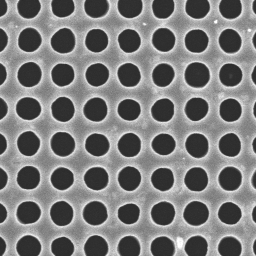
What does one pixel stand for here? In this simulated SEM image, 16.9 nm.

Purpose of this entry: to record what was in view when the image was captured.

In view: a regular array of holes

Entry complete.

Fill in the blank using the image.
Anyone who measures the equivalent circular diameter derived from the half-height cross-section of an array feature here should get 0.397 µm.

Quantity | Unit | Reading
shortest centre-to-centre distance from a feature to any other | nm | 562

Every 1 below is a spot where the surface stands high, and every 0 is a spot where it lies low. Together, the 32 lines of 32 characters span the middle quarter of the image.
00111100001111000011111000011110
00111100000110000001110000011100
00011000000110000001110000001100
00011000000111000001110000011100
00111100001111000001110000011110
11111110011111100011111000111111
11111111111111111111111111111111
11111111111111111111111111111111
01111110011111111111111110111111
00111100001111000011111000011110
00011000000111000001110000011110
00011000000110000001110000001100
00011000000111000001110000011110
00111100001111100011110000011110
11111111011111111111111101111111
11111111111111111111111111111111
11111111111111111111111111111111
01111110011111100011111100111111
00111100001111000001110000011110
00011000000111000001110000001100
00011000000110000001110000001100
00011000000111000001110000011110
00111110001111000011111100111110
11111111111111111111111111111111
11111111111111111111111111111111
11111111111111111111111111111111
01111100001111100011111000111110
00111000000111000001110000011110
00011000000111000001110000011100
00111000000111000001110000011100
00111100001111000001110000011110
11111110011111100011111100111110